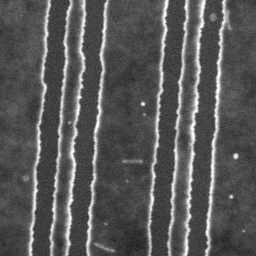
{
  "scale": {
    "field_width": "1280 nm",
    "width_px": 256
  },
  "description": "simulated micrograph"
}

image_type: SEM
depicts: lines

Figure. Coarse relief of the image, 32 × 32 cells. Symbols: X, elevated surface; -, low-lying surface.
XXXXXX---XX--XXXXXXXX--XXX--XXXX
XXXXXX--XXX--XXXXXXXX--XX---XXXX
XXXXXX--XXX--XXXXXXXX--XX---XXXX
XXXXXX--XX---XXXXXXXX--XX---XXXX
XXXXXX--XX---XXXXXXXX--XX---XXXX
XXXXXX--XX---XXXXXXX---XX---XXXX
XXXXXX--XX---XXXXXXX---XX--XXXXX
XXXXXX--XX---XXXXXXX---XX--XXXXX
XXXXXX--XXX--XXXXXXX---XX--XXXXX
XXXXX---XX---XXXXXXX---XX--XXXXX
XXXXXX--XX---XXXXXXX--XXX--XXXXX
XXXXXX--XX--XXXXXXXX--XXX--XXXXX
XXXXX---XX--XXXXXXXX--XXX--XXXXX
XXXXX---XX--XXXXXXXX--XXX--XXXXX
XXXXX---XX--XXXXXXXX--XX---XXXXX
XXXXX--XXX--XXXXXXXX--XX---XXXXX
XXXXX--XXX--XXXXXXXX--XX---XXXXX
XXXXX--XX---XXXXXXXX--XX---XXXXX
XXXXX--XX---XXXXXXXX--XX---XXXXX
XXXXX--XX---XXXXXXX---XX---XXXXX
XXXXX--XX---XXXXXXX---XX--XXXXXX
XXXXX--XX---XXXXXXX---XX--XXXXXX
XXXXX--XX---XXXXXXX---XX--XXXXXX
XXXXX--XX--XXXXXXXX---XX--XXXXXX
XXXX---XX---XXXXXXX---XX--XXXXXX
XXXX---XX--XXXXXXXX---XX--XXXXXX
XXXX---XX--XXXXXXXX--XXX--XXXXXX
XXXX---XX--XXXXXXXX--XXX--XXXXXX
XXXX--XXX--XXXXXXXX--XXX--XXXXXX
XXXX--XXX--XXXXXXXX--XX---XXXXXX
XXXX--XXX--XXXXXXXX--XX---XXXXXX
XXXX--XXX--XXXXXXXX--XX---XXXXXX